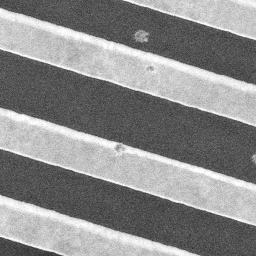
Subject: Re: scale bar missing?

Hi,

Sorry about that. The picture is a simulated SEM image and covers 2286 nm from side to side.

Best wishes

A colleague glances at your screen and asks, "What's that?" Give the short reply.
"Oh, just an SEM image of lines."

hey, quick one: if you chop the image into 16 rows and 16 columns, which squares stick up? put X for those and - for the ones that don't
---------XXXXXXX
XXX----------XXX
XXXXXX----------
-XXXXXXXXX------
-----XXXXXXXX---
--------XXXXXXXX
-----------XXXXX
XX-------------X
XXXXXX----------
-XXXXXXXX-------
----XXXXXXXX----
-------XXXXXXXXX
X----------XXXXX
XXXX----------XX
XXXXXXX---------
--XXXXXXXXX-----